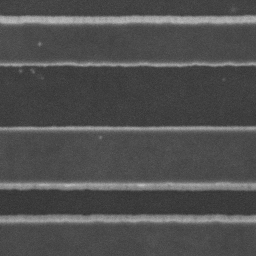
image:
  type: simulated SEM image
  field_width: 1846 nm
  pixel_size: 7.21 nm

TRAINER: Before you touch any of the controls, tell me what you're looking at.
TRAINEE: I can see lines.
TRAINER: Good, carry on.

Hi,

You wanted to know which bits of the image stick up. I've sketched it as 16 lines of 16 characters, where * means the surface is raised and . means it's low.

................
****************
****************
****************
................
................
................
................
****************
****************
****************
****************
................
................
****************
****************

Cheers